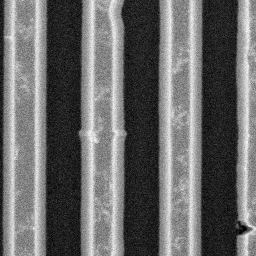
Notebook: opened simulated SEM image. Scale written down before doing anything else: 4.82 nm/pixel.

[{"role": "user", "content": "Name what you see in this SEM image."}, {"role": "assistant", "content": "one or a few lines or trenches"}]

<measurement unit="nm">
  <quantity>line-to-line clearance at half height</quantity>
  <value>222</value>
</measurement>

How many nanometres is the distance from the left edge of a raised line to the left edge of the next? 375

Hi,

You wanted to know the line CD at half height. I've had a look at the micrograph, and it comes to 154 nm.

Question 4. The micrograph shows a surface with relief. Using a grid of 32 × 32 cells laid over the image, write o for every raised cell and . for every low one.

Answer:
.oooo......oooo......ooo......oo
.oooo......ooo.......ooo......oo
.oooo......oooo......ooo......oo
.oooo......oooo......ooo......oo
.oooo......oooo......ooo......oo
.oooo......oooo......ooo......oo
.oooo......oooo......ooo......oo
.oooo......oooo......ooo......oo
.oooo......oooo......ooo......oo
.oooo......oooo......ooo......oo
.oooo......oooo......ooo......oo
.oooo......oooo......ooo......oo
.oooo......oooo......ooo......oo
.oooo......oooo......ooo......oo
.oooo......oooo......ooo......oo
.oooo......oooo......ooo......oo
.oooo......oooo......ooo......oo
.oooo......oooo......ooo......oo
.oooo......oooo......ooo......oo
.oooo......oooo......ooo......oo
.oooo......oooo......ooo......oo
.oooo......oooo......ooo......oo
.oooo......oooo......ooo......oo
.oooo......oooo......ooo......oo
.oooo......oooo......ooo......oo
.oooo......oooo......ooo......oo
.oooo......oooo......ooo......oo
.oooo......oooo......ooo.......o
.oooo......oooo......ooo.......o
.oooo......oooo......ooo......oo
.oooo......oooo......ooo......oo
.oooo......oooo......ooo......oo